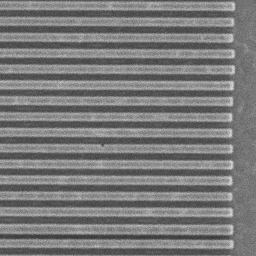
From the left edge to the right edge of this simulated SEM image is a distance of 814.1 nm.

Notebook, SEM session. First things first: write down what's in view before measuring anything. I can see parallel lines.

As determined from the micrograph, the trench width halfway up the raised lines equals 7.77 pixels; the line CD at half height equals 24.7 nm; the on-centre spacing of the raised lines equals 50.5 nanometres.